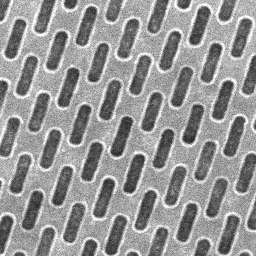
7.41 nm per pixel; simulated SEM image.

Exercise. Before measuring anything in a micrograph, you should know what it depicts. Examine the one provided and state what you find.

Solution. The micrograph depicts a regular array of holes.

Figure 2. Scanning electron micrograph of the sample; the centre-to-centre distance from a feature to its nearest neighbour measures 0.284 µm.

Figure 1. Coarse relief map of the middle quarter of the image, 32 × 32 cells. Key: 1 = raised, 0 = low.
11111110001111111100001100011111
10001100001111111100011100111000
10001100011111111000011111111000
00001100011111111000011111110000
00011100011000111000111111110000
00011111111000010000111111110001
00011111111000110000111111100001
00111111110000111001110011100001
00111111110000111111100001100011
00111111110001111111100001100011
01110001100001111111100011100011
11110001100001111111000011111111
11100001100011111111000011111110
11100011100011000111000111111110
11000011111111000110000111111110
11000011111111000110000111111100
11000011111110000110001110011100
11000111111110001111111100001100
10000111111110001111111100001000
10001110011100001111111100011100
11111100001100001111111000011111
11111100001100011111111000011111
11111100001100011101111000111111
11111100011111111000110000111111
11111000011111111000110000111111
01111000011111110000110001111011
00110000111111110000111111100001
00110000111111110001111111100001
00110001110111100001111111100011
00111111110001100001111111000011
01111111100001100011111111000011
01111111100001100011101111000111